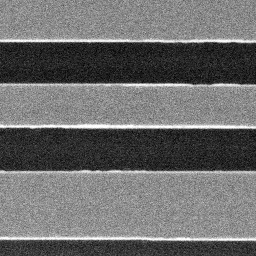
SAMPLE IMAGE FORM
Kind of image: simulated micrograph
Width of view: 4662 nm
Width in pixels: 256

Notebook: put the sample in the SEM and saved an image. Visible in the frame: lines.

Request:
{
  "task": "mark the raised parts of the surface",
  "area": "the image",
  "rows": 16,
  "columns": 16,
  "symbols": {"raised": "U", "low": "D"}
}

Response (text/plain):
UUUUUUUUUUUUUUUU
UUUUUUUUUUUUUUUU
UUUUUUUUUUUUUUUU
DDDDDDDDDDDDDDDD
DDDDDDDDDDDDDDDD
UUUUUUUUUUUUUUUU
UUUUUUUUUUUUUUUU
UUUUUUUUUUUUUUUU
DDDDDDDDDDDDDDDD
DDDDDDDDDDDDDDDD
DDDDDDDDDDDDDDDD
UUUUUUUUUUUUUUUU
UUUUUUUUUUUUUUUU
UUUUUUUUUUUUUUUU
UUUUUUUUUUUUUUUU
DDDDDDDDDDDDDDDD